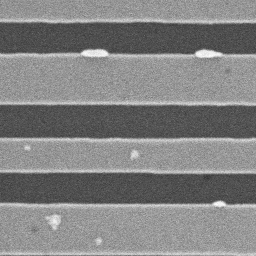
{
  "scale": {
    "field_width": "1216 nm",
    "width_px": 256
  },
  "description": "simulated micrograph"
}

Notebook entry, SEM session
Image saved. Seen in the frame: lines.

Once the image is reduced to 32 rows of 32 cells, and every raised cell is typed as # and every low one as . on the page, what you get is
################################
################################
################################
................................
................................
................................
..........###............##.....
################################
################################
################################
################################
################################
################################
................................
................................
................................
................................
################################
################################
################################
################################
################################
................................
................................
................................
###.....#.................##....
################################
################################
################################
################################
################################
################################